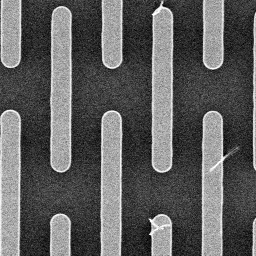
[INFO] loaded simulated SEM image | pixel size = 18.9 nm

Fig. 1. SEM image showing groups of lines, slits or small figures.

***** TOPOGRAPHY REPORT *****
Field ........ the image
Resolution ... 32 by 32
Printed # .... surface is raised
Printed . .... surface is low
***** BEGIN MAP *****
###..........##..........###....
###....##....##....##....###....
###...###....##....##....###....
###...###....##....##.....##....
###...###....##....##....###....
###...###....##....###...###....
###...###....##....##....###....
###...###....##....##....###....
......###..........##.....#.....
......###..........##...........
......###..........##...........
......###..........##...........
......###..........##...........
......###..........##...........
##....###....##....##.....##....
###...###....##....##....###....
###...###....##....##....###....
###...###....##....##....###....
##....###....##....##....###....
###...###....##....##....###....
###...###....##....##....###....
##...........##..........###....
##...........##..........###....
##...........##..........###....
##...........##..........###....
##...........##..........###....
##...........##..........###....
##....###....##....##....###....
##....###....##....##....###....
##....###....##....##....###....
##....###....##....##....###....
##....###....##....##....###....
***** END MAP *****